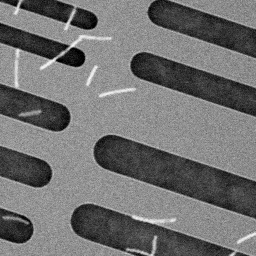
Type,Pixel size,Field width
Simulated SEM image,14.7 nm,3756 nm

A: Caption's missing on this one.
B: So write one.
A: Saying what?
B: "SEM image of groups of lines, slits or small figures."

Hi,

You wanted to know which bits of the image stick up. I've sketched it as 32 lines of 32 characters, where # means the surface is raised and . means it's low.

#.......###########...##########
####.......#######.......#######
#######.....#######.........####
..########..########...........#
.....##################.........
........##################......
###.......###################...
#######....#####.....###########
################........########
#################..........#####
###################...........##
...###################..........
......###################.......
........####################....
.........######################.
###......#######################
################################
############....################
.###########.......#############
....########..........##########
......######.............#######
......########..............####
#.....###########..............#
####.###############............
#######################.........
##########################......
..#######......##############...
....#####........###############
....#####............###########
....######..............########
##.#########...............#####
###############...............##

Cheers